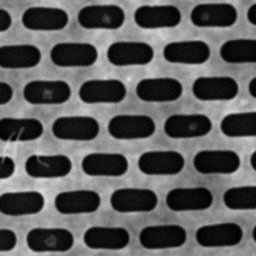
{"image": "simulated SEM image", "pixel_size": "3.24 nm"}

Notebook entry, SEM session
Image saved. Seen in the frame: groups of lines, slits or small figures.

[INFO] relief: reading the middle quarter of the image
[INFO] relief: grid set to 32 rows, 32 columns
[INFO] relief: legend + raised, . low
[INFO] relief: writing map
......+++++++..+++++++++++++++++
++++++++++++++++++++++++++++++++
++++++++++++++++++++++++++++++++
++++++++++++++++++++++++...+++++
+++++.........+++++..........+++
.+++...........+++...........+++
..++...........+++............++
..++...........+++...........+++
.+++...........++++..........+++
+++++.........+++++++....+++++++
++++++++++++++++++++++++++++++++
++++++++++++++++++++++++++++++++
++++++++++++++++++++++++++++++++
.......+++++..........++++......
.........++............++.......
.........++............++.......
.........++............++.......
.........+++..........++++......
........+++++.......+++++++.....
++++++++++++++++++++++++++++++++
++++++++++++++++++++++++++++++++
++++++++++++++++++++++++++++++++
++++++........++++++.........+++
.++++..........++++...........++
..++............++............++
..++............+++...........++
..+++...........+++..........+++
.+++++.........+++++........++++
++++++++++++++++++++++++++++++++
++++++++++++++++++++++++++++++++
++++++++++++++++++++++++++++++++
+++....++++++.........+++++.....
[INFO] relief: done